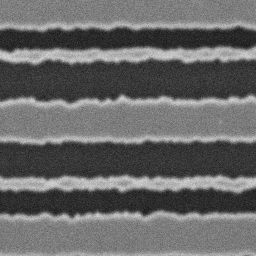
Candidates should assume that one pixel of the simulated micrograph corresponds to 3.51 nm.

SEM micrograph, lines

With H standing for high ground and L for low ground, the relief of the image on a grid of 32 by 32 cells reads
HHHHHHHHHHHHHHHHHHHHHHHHHHHHHHHH
HHHHHHHHHHHHHHHHHHHHHHHHHHHHHHHH
HHHHHHHHHHHHHHHHHHHHHHHHHHHHHHHH
HHHHHHHHHHHLHHLLHHHHHHHHHHHHHLHH
LLLLLLLLLLLLLLLLLLLLLLLLLLLLLLLL
LLLLLLLLLLLLLLLLLLLLLLLLLLLLLLLL
HHHHHHHHHHHHHHHHHHHHHHHHHHHHHHHH
HHHHHLLHHHHHLHHLHHLLLLLHHHHLHLLL
LLLLLLLLLLLLLLLLLLLLLLLLLLLLLLLL
LLLLLLLLLLLLLLLLLLLLLLLLLLLLLLLL
LLLLLLLLLLLLLLLLLLLLLLLLLLLLLLLL
LLLLLLLLLLLLLLLLLLLLLLLLLLLLLLLL
LLHHLLLLLLHHLLHHHHHHHHLLLHHHHHHH
HHHHHHHHHHHHHHHHHHHHHHHHHHHHHHHH
HHHHHHHHHHHHHHHHHHHHHHHHHHHHHHHH
HHHHHHHHHHHHHHHHHHHHHHHHHHHHHHHH
HHHHHHHHHHHHHHHHHHHHHHHHHHHHHHHH
HHHHHHHHHHHHHHHHHHHHHHHHHHHLHHHH
LLLLLLLLLLLLLLLLLLLLLLLLLLLLLLLL
LLLLLLLLLLLLLLLLLLLLLLLLLLLLLLLL
LLLLLLLLLLLLLLLLLLLLLLLLLLLLLLLL
LLLLLLLLLLLLLLLLLLLLLLLLLLLLLLLL
HHHHHHHHHHHHHHHHHHHHHHHHHHHHHHHH
HHHHHHHHHHHHHHHHHHHHHHHHHHHHHHHH
LLLLLLLLLLLLLLLLLLLLLLLLLLLLLLLL
LLLLLLLLLLLLLLLLLLLLLLLLLLLLLLLL
LLLLLLLLLLLLLLLLLLLLHLLLLLLLLLLL
HHHHHHHHHHHHHHHHHHHHHHHHHHHHHHHH
HHHHHHHHHHHHHHHHHHHHHHHHHHHHHHHH
HHHHHHHHHHHHHHHHHHHHHHHHHHHHHHHH
HHHHHHHHHHHHHHHHHHHHHHHHHHHHHHHH
HHHHHHHHHHHHHHHHHHHHHHHHHHHHHHHH